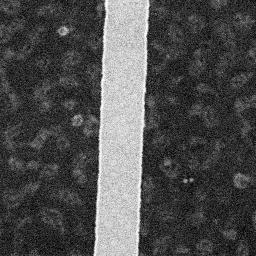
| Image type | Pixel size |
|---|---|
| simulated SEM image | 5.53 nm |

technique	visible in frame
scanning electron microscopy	one or a few lines or trenches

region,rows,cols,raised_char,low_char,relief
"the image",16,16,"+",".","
.......++.......
.......++.......
.......++.......
......+++.......
......+++.......
......+++.......
......+++.......
......+++.......
......+++.......
......+++.......
......+++.......
......+++.......
......+++.......
......+++.......
......+++.......
......+++.......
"